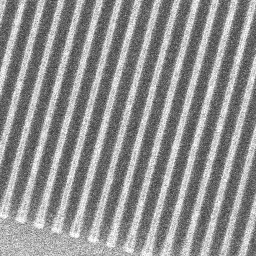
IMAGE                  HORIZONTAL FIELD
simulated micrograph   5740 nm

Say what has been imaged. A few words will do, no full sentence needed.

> parallel lines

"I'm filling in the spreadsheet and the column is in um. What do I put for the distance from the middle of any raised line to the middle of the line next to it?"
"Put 0.416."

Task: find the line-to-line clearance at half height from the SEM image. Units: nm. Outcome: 254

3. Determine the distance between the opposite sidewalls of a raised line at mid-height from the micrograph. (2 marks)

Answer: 168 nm